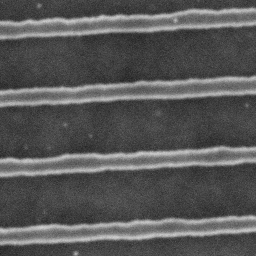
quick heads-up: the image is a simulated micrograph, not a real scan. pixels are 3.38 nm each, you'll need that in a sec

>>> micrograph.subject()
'lines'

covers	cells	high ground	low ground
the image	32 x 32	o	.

................................
......................oooooooooo
......oo.ooooooooooooooooooooooo
oooooooooooooooooooooooooo......
oooooo..........................
................................
................................
................................
................................
................................
...............ooooooooooooooooo
oooooooooooooooooooooooooooooooo
oooooooooooooo..................
................................
................................
................................
................................
................................
...........................oo.oo
........oooooooooooooooooooooooo
oooooooooooooooooooooooooooo....
ooooooooo.......................
................................
................................
................................
................................
................................
.....................oo..ooooooo
...ooooooooooooooooooooooooooooo
oooooooooooooooooooooo..........
oo..............................
................................